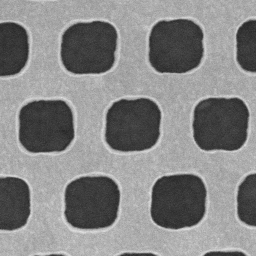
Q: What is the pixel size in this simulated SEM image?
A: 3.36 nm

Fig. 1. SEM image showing holes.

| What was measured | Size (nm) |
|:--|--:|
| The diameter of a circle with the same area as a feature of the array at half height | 200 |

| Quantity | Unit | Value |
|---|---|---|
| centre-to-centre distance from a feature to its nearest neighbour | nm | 293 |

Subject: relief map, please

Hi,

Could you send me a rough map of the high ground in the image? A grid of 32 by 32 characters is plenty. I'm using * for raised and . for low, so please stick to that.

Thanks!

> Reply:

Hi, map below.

********************************
********************************
********************....*******.
...*****......*****......*****..
....****.......****......*****..
....****.......****.......***...
....****.......***........***...
....****......****.......*****..
...*****......*****......*****..
..******************************
********************************
********************************
****....*******....******.....**
**.......****.......****.......*
**.......****.......****.......*
**.......****.......****.......*
**.......****.......****.......*
**.......****.......****.......*
***......*****.....******.....**
********************************
********************************
********************************
...******.....******.....*****..
....****.......****.......****..
....****.......****.......****..
....****.......****.......****..
....****.......****.......****..
....****.......****......*****..
...******....********..*********
********************************
********************************
**************************....**